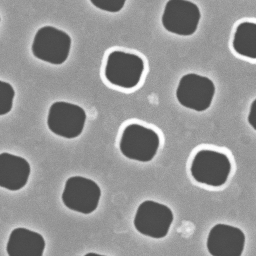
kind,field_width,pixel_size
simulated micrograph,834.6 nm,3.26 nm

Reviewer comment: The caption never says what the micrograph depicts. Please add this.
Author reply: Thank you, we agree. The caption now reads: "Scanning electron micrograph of a regular array of holes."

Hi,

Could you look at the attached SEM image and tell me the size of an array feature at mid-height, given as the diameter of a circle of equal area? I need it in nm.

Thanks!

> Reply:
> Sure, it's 124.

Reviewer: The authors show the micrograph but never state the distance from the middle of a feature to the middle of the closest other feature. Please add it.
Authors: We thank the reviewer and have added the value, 246 nanometers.